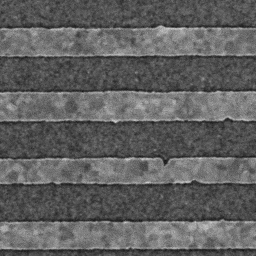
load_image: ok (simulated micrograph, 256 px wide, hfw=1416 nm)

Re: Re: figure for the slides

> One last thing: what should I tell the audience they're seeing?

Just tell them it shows one or a few lines or trenches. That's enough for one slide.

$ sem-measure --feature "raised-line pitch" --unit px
64.4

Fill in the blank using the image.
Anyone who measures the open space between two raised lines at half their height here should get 212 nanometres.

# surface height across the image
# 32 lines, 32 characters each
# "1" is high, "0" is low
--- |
00000000000000000000000000000000
00000000000000000000000000000000
00000000000000000000000000000000
00001000100000000001100000001000
11111111111111111111111111111111
11111111111111111111111111111111
11111111111111111111111111111111
00000000000000000000000000000000
00000000000000000000000000000000
00000000000000000000000000000000
00000000000000000000000000000000
00000000000001111000001100011101
11111111111111111111111111111111
11111111111111111111111111111111
11111111111111111111111111111111
00000000000000000000000000000000
00000000000000000000000000000000
00000000000000000000000000000000
00000000000000000000000000000000
00000000000000000000000000000000
11111111111111111111111111111111
11111111111111111111111111111111
11111111111111111111111111111111
00000000000000000000000000000000
00000000000000000000000000000000
10000000000000000000000000000000
00000000000000000000000000000000
00000000000000000000000000000000
11111111111111111111111111111111
11111111111111111111111111111111
11111111111111111111111111111111
00000000000000000000000000000000